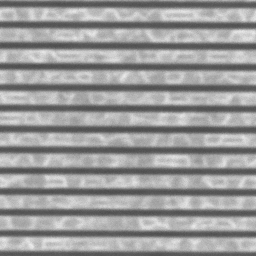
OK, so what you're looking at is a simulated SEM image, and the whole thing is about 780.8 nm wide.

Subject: parallel lines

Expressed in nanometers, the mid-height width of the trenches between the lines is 23.3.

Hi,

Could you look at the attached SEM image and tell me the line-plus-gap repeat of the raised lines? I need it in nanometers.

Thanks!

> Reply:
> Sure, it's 63.8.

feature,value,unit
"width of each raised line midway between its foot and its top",40.9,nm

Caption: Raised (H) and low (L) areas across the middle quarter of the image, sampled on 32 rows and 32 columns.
LLLLLLLLLLLLLLLLLLLLLLLLLLLLLLLL
LLLLLLLLLLLLLLLLLLLLLLLLLLLLLLLL
HHHHHHHHHHHHHHHHHHHHHHHHHHHHHHHH
HHHHHHHHHHHHHHHHHHHHHHHHHHHHHHHH
HHHHHHHHHHHHHHHHHHHHHHHHHHHHHHHH
LLLLLLLLLLLLLLLLLLLLLLLLLLLLLLLL
LLLLLLLLLLLLLLLLLLLLLLLLLLLLLLLL
HHHHHHHHHHHHHHHHHHHHHHHHHHHHHHHH
HHHHHHHHHHHHHHHHHHHHHHHHHHHHHHHH
HHHHHHHHHHHHHHHHHHHHHHHHHHHHHHHH
LLLLLLLLLLLLLLLLLLLLLLLLLLLLLLLL
LLLLLLLLLLLLLLLLLLLLLLLLLLLLLLLL
HHHHHHHHHHHHHHHHHHHHHHHHHHHHHHHH
HHHHHHHHHHHHHHHHHHHHHHHHHHHHHLHH
HHHHHHHHHHHHHHHHHHHHHHHHHHHHHHHH
LLLLLLLLLLLLLLLLLLLLLLLLLLLLLLLL
LLLLLLLLLLLLLLLLLLLLLLLLLLLLLLLL
HHHHHHHHHHHHHHHHHLLLLLLLLLLLLLLL
HHHHHHHHHHHHHHHHHHHHHHHHHHHHHHHH
HHHHHHHHHHHHHHHHHHHHHHHHHHHHHHHH
LLLLLLHHLLLLLLLLLLLLLLHLLLLLLLHL
LLLLLLLLLLLLLLLLLLLLLLLLLLLLLLLL
LLLLLLLLLLLLLLLLLLLLLLLLLLLLLLLL
HHHHHHHHHHHHHHHHHHHHHHHHHHHLLHHH
HHHHHHHHHHHHLHHHHHHHHHHHHHLLHHHH
HHHHHHHHHHHHHHHHHHHHHHHHHHHHHHHH
LLLLLLLLLLLLLLLLLLLLLLLLLLLLLLLL
LLLLLLLLLLLLLLLLLLLLLLLLLLLLLLLL
HHHHHHHHHHHHHHHHHHHHHHHHHHHHHHHH
HHHHHHHHHHHHHHLHHHHHHHHHHHHHHHHH
HHHHHHHHHHHHHHHHHHHHHHHHHHHHHHHH
LLLLLLLLLLLLLLLLLLLLLLLLLLLLLLLL